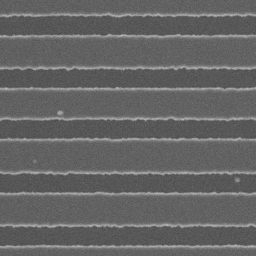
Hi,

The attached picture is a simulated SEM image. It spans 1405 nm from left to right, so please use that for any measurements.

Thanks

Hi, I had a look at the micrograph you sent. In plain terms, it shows lines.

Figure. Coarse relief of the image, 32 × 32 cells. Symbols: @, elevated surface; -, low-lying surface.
@@@@@@@@@@@@@@@@@@@@@@@@@@@@@@@@
@@@@@@@@@@@@@@@@@@@@@@@@@@@@@@@@
--------------------------------
--------------------------------
@-@@@@@@@@@@@@@@@@@@@@@@@@@@@@@@
@@@@@@@@@@@@@@@@@@@@@@@@@@@@@@@@
@@@@@@@@@@@@@@@@@@@@@@@@@@@@@@@@
@@@@@@@@@@@@@@@@@@@@@@@@@@@@@@@@
@@@@@@@@@@@@@@@@@@@@@@@@@@@@@@@@
--------------------------------
--------------------------------
@@@@@@@@@@@@@@@@@@@@@@@@@@@@@@@@
@@@@@@@@@@@@@@@@@@@@@@@@@@@@@@@@
@@@@@@@@@@@@@@@@@@@@@@@@@@@@@@@@
@@@@@@@@@@@@@@@@@@@@@@@@@@@@@@@@
--------------------------------
--------------------------------
@@@@@@@@@@@@@@@@@@@@@@@@@@@@@@@@
@@@@@@@@@@@@@@@@@@@@@@@@@@@@@@@@
@@@@@@@@@@@@@@@@@@@@@@@@@@@@@@@@
@@@@@@@@@@@@@@@@@@@@@@@@@@@@@@@@
@@@@@@@@@@@@@@@@@@@@@@@@@@@@@@@@
--------------------------------
--------------------------------
@@@@@@@@@@@@@@@@@@@@@@@@@@@@@@@@
@@@@@@@@@@@@@@@@@@@@@@@@@@@@@@@@
@@@@@@@@@@@@@@@@@@@@@@@@@@@@@@@@
@@@@@@@@@@@@@@@@@@@@@@@@@@@@@@@@
--------------------------------
--------------------------------
--------------------------------
@@@@@@@@@@@@@@@@@@@@@@@@@@@@@@@@